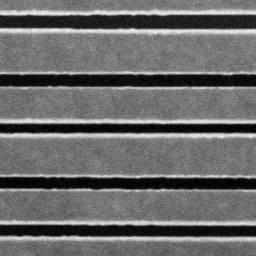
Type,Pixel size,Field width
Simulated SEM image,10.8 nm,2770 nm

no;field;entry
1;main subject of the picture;lines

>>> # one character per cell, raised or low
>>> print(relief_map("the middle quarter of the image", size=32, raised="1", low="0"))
11111111111111111111111111111111
11111111111111111111111111111111
00000000000000000000000000000000
00000000000000000000000000000000
00000000000000000000000000000000
00000000000000000000000000000000
11111111111111111111111111111111
11111111111111111111111111111111
11111111111111111111111111111111
11111111111111111111111111111111
11111111111111111111111111111111
11111111111111111111111111111111
11111111111111111111111111111111
11111111111111111111111111111111
11111111111111111111111111111111
00000000000000000000000000000000
00000000000000000000000000000000
00111101101100011000001110110100
11111111111111111111111111111111
11111111111111111111111111111111
11111111111111111111111111111111
11111111111111111111111111111111
11111111111111111111111111111111
11111111111111111111111111111111
11111111111111111111111111111111
11111111111111111111111111111111
11111111111111111111111111111111
11111111111111111111111111111111
00000000000000000000000000000000
00000000000000000000000000000000
00000000000000000000000000000000
01111110011111100000010011100000